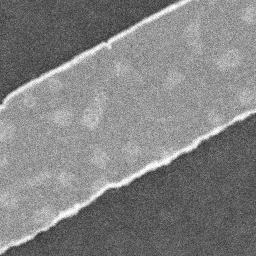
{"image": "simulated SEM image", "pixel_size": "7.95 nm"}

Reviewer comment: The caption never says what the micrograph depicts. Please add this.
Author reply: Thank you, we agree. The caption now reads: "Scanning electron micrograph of one or a few lines or trenches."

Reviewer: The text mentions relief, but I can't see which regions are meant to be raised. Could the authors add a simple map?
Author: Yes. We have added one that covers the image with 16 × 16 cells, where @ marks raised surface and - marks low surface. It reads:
-----------@@@@@
---------@@@@@@@
-------@@@@@@@@@
-----@@@@@@@@@@@
---@@@@@@@@@@@@@
-@@@@@@@@@@@@@@@
@@@@@@@@@@@@@@@@
@@@@@@@@@@@@@@@-
@@@@@@@@@@@@@---
@@@@@@@@@@@-----
@@@@@@@@@-------
@@@@@@@---------
@@@@@@----------
@@@@------------
@@--------------
@---------------